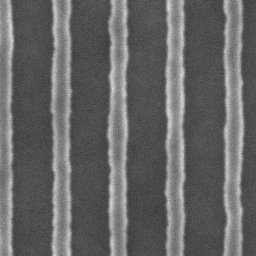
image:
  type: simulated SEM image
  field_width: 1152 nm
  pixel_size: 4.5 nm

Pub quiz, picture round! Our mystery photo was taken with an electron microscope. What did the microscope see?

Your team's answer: lines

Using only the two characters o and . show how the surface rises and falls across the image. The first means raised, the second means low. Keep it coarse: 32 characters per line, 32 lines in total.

o......oo.....oo.....oo.....oo..
o......oo.....oo.....oo.....oo..
o......oo.....oo.....oo.....oo..
o......oo.....oo.....oo.....oo..
oo.....oo.....oo.....oo.....oo..
oo.....oo.....oo.....oo.....oo..
o......oo.....oo.....oo.....oo..
o......oo.....oo.....oo.....oo..
o......oo.....oo.....oo.....oo..
o......oo.....oo.....oo.....oo..
o......oo.....oo.....oo.....oo..
o......oo.....oo.....oo.....oo..
o.....ooo.....oo.....oo.....oo..
o.....ooo.....oo.....oo.....oo..
o......oo.....oo.....oo.....oo..
o......oo.....oo.....oo.....oo..
o......oo.....oo.....oo.....oo..
o......oo.....oo.....oo.....oo..
o......oo.....oo.....oo.....oo..
o......oo.....oo.....oo.....oo..
o......oo.....oo.....oo.....oo..
o......oo.....oo.....oo.....oo..
o......oo.....oo.....oo.....oo..
o......oo.....oo.....oo.....oo..
o......oo.....oo.....oo.....oo..
o......oo.....oo.....oo.....oo..
o......oo.....oo.....oo.....oo..
o......oo.....oo.....oo.....oo..
o......oo.....oo.....oo.....oo..
o......oo.....oo.....oo.....oo..
o......oo.....oo.....oo.....oo..
o......oo.....oo.....oo.....oo..